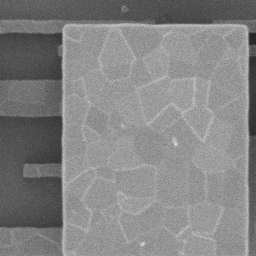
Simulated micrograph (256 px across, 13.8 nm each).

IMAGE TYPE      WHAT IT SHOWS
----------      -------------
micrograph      wiring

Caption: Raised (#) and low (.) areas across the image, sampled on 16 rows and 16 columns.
................
.......##.......
....###########.
....############
....###########.
....############
....############
....###########.
....############
....############
....###########.
....###########.
....###########.
....###########.
....###########.
....###########.